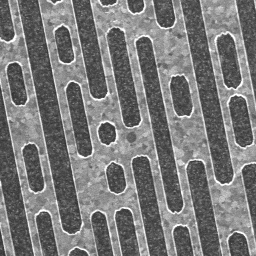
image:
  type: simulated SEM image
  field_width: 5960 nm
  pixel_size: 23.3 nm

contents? parallel lines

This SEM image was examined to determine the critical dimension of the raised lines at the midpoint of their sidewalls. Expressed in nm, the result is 183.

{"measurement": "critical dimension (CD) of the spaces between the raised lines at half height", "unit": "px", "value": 19.3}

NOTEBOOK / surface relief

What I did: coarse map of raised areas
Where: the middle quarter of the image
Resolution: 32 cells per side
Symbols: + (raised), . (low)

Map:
+++++.....++.....++....+++++++++
+++++.....++.....++.....++++++++
++++++....++.....++.....++++++++
++++++.....+.....++.....+++....+
+..+++.....++.....++....++.....+
+...++.....++.....++....++.....+
....++.....++.....++....++......
.....++....++.....++.....++.....
+....++...+++.....++.....++.....
+....+++++++++.....++....++.....
+....+++++++++.....++....++.....
+....+++++++++.....++....++.....
+.....++++++++.....++.....++....
++....++++++++.....++.....++++++
++....++++.++++....+++....++++++
++....+++....++...++++....++++++
++....++.....+++++++++....++++++
++.....+.....+++++++++.....+++++
++.....++....+++++++++.....+++++
.++....++....++++++++++....+++++
.++....++++++++++++++++....+++++
.++....++++++++++++++++....+++++
.++....++++++++++++++++.....++++
..++++++++++++++++...++.....++++
..++++++++++.++++.....+.....+++.
..+++++++++....++.....++....+++.
..++++++++.....++.....++....++..
..++++++++.....++.....++.....++.
...++++++++....++.....++.....++.
...++++++++.....++.....+.....++.
...++++++++.....++.....++....++.
...++++++++....+++.....++....++.